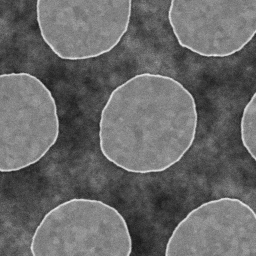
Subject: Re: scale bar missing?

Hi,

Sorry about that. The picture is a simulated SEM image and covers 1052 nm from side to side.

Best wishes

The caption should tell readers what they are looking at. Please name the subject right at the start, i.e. raised bodies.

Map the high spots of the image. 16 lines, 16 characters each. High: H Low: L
LLHHHHHHLLLHHHHH
LLHHHHHHLLLHHHHH
LLLHHHHLLLLHHHHH
LLLLHHLLLLLLLLLL
LLLLLLLLLLLLLLLL
HHHLLLLHHHHLLLLL
HHHLLLLHHHHHLLLL
HHHHLLHHHHHHLLLH
HHHHLLHHHHHHLLLH
HHHLLLLHHHHHLLLL
HLLLLLLLHHLLLLLL
LLLLLLLLLLLLLLLL
LLLLLLLLLLLLLLHL
LLLHHHHLLLLLHHHH
LLHHHHHHLLLHHHHH
LLHHHHHHLLHHHHHH